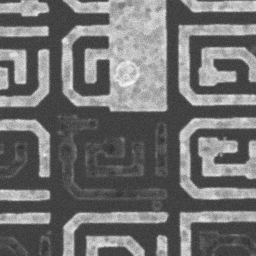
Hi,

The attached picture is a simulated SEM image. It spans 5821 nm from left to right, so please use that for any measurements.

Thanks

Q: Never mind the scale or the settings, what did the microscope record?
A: wiring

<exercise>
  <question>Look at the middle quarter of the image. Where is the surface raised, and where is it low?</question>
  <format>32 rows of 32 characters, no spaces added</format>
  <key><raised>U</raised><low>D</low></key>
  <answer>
UUDDDDUUDDDDUUUUUUUUUUUUUDDDDUUD
UUDDDDUUDDDDUUUUUUUUUUUUUDDDDUUD
UUDDDDUUDDDDUUUUUUUUUUUUUDDDDUUD
UUDDDDUUDDDDUUUUUUUUUUUUUDDDDUUD
UUDDDDDDDDDDUUUUUUUUUUUUUDDDDUUD
UUDDDDDDDDDDUUUUUUUUUUUUUDDDDUUD
UUDDDDDDDDDDUUUUUUUUUUUUUDDDDUUU
UUUDDDDDDDDDUUUUUUUUUUUUUDDDDDUU
DUUUUUUUUUUUUUUUUUUUUUUUUDDDDDDU
DDUUUUUUUUUUUUUUUUUUUUUUUDDDDDDD
DDDDDDDDDDDDUUUUUUUUUUUUUDDDDDDD
DDDDDDDDDDDDUUUUUUUUUUDDDDDDDDDD
DDDDDDDDDDDDDDDDDDDDDDDDDDDDDDDD
UUUDDDDDDDDDDDDDDDDDDDDDDDDDDDDD
UUUUUUUUDDDDDDDDDDDDDDDDDDDDDDDD
UUUUUUUUDDDDDDDDDDDDDDDDUDDDDDDU
UUUDDDDDDDDDDDDDDDDDDDDUUDDDDDUU
UUDDDDDDDDDDDDDDDDDDDDDUUDDDDUUU
UUDDDDDDDDDDDDDDDDDDDDDUUDDDDUUD
UUDDDDDDDDUUUUUDDDDDDDDUUDDDDUUD
UUUDDDUUUUUUUUUDDUUUDDDUUDDDDUUD
UUUDDDUUUUUUUUUDDUUUDDDUUDDDDUUD
UUUDDDUUDDUUUUUDDUUUDDDUUDDDDUUD
UUUDDDUUDDDDDDDDDDUUDDDUUDDDDUUD
UUDDDDUUDDDDDDDDDDUUDDDUUDDDDUUD
UUDDDDUUDDDDDDDDDUUUDDDUUDDDDUUD
UUDDDDUUUUUUUUUUUUUUDDDUUDDDDUUD
UUDDDDUUUUUUUUUUUUUUDDDDUDDDDUUD
UUDDDDDDDDDDDDDDDDDDDDDDDDDDDUUD
UUDDDDDDDDDDDDDDDDDDDDDDDDDDDUUU
UUUDDDDDDDDDDDDDDDDDDDDDDDDDDDUU
DUUUDDDDDDDDDDDDDDDDDUUUDDDDDDDU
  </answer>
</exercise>